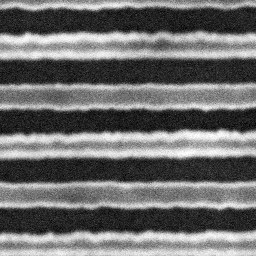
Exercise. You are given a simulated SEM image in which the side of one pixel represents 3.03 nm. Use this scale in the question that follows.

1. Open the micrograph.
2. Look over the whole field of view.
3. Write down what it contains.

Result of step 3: lines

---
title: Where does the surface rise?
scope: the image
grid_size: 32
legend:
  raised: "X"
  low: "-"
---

XXXXXXXXXXXXXXXXXXXXXXXXXXXXXXXX
--------------------------------
--------------------------------
--------------------------------
X--XX-XXXXXXXXXXXXXXXXXXXXXXXXXX
XXXXXXXXXXXXXXXXXXXXXXXXXXXXXXXX
XXXXXXXXXXXXXXXXXXXXXXXXXXXXXXXX
--------------------------------
--------------------------------
--------------------------------
--------------------------------
XXXXXXXXXXXXXXXXXXXXXXXXXXXXXXXX
XXXXXXXXXXXXXXXXXXXXXXXXXXXXXXXX
XXXXX-XXXXXX-XXXX-XXXXXX-XXXXX--
--------------------------------
--------------------------------
----------------------XXX--XXX-X
XXXXXXXXXXXXXXXXXXXXXXXXXXXXXXXX
XXXXXXXXXXXXXXXXXXXXXXXXXXXXXXXX
XXXXXXXXXXXXXXXXXXXXXXXX--X-----
--------------------------------
--------------------------------
--------------------------------
XXXXXXXXXXXXXXXXXXXXXXXXXXXXXXXX
XXXXXXXXXXXXXXXXXXXXXXXXXXXXXXXX
XXXXXXXXXXXXXXXXXXXXXXXXXXXXXXXX
--------------------------------
--------------------------------
--------------------------------
XXXX-XXXXXXXXXXXXXXXXXXXXXXXXXXX
XXXXXXXXXXXXXXXXXXXXXXXXXXXXXXXX
XXXXXXXXXXXXXXXXXXXXXXXXXXXXXXXX